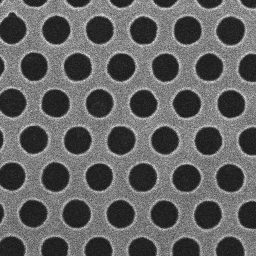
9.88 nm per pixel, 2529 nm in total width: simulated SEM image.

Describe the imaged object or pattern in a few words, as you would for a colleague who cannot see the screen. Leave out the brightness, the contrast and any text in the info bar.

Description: a regular array of holes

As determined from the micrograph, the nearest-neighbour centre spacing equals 420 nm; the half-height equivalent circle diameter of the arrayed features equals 274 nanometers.